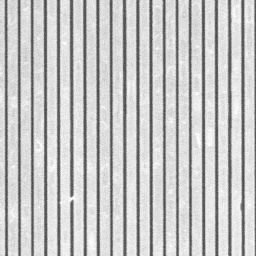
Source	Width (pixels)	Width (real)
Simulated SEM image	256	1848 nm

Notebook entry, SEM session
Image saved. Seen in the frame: parallel lines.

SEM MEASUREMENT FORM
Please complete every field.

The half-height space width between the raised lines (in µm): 0.0217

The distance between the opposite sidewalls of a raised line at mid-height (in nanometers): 72.2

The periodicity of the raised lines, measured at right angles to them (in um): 0.095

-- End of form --